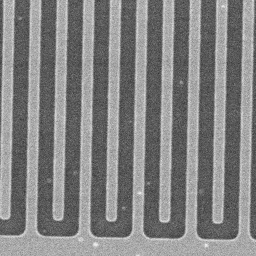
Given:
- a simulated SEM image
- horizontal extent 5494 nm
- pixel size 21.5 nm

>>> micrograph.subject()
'groups of lines, slits or small figures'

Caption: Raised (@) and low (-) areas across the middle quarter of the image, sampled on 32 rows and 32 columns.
-----@@----@@@----@@-----@@----@
-----@@----@@@----@@-----@@----@
-----@@----@@@----@@-----@@----@
-----@@----@@@----@@-----@@----@
-----@@----@@@----@@-----@@----@
-----@@----@@@----@@-----@@----@
-----@@----@@@----@@-----@@----@
-----@@----@@@----@@-----@@----@
-----@@----@@@----@@-----@@----@
-----@@----@@@----@@-----@@----@
-----@@----@@@----@@----@@@----@
-----@@----@@-----@@----@@@----@
-----@@----@@-----@@----@@@----@
----@@@----@@-----@@----@@@----@
----@@@----@@-----@@----@@@----@
----@@@----@@-----@@----@@@----@
----@@@----@@-----@@----@@@----@
----@@@----@@-----@@----@@@----@
----@@@----@@-----@@----@@@----@
----@@@----@@-----@@----@@@----@
----@@@----@@-----@@----@@@----@
----@@@----@@-----@@----@@@----@
----@@@----@@-----@@----@@@----@
----@@@----@@-----@@----@@@----@
----@@@----@@-----@@----@@@----@
----@@@----@@-----@@----@@@----@
----@@@----@@-----@@----@@@----@
----@@@----@@-----@@----@@@----@
----@@@----@@-----@@----@@@----@
----@@@----@@-----@@----@@-----@
----@@@----@@----@@@----@@-----@
----@@-----@@----@@@----@@-----@